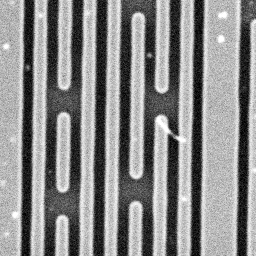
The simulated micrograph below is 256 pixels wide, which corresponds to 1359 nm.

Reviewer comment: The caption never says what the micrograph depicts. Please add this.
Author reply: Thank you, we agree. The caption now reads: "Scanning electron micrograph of groups of lines, slits or small figures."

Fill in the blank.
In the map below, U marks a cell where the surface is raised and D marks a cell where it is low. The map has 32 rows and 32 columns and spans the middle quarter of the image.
UUDDDUUUDDDUUUDDDUUUDDDUUUDDDUUU
UUDDDUUUDDDUUUDDDUUUDDDUUUDDDUUU
UUDDDUUUDDDUUUDDDUUUDDDUUUDDDUUU
UUDDDUUUDDDUUUDDDUUUDDDUUUDDDUUU
UDDDDUUUDDDUUUDDDUUUDDDUUUDDDUUU
UDDDDUUDDDDUUUDDDUUUDDDUUUDDDUUU
DDDDDUUDDDDUUUDDDUUUDDDUUUDDDUUU
DDDDDUUDDDDUUUDDDUUUDDDDDDDDDUUU
DDDDDUUDDDDUUUDDDUUUDDDDDDDDDUUU
DDDDDUUDDDDUUUDDDUUUDDDDDDDDDUUU
DDDDDUUDDDDUUUDDDUUUDDDDDDDDDUUU
DDDDDUUDDDDUUUDDDUUUDDDDDDDDDUUU
UDDDDUUDDDDUUUDDDUUUDDDDDDDDDUUU
UDDDDUUDDDDUUUDDDUUUDDDUUUDDDUUU
UDDDDUUDDDDUUUDDDUUUDDDUUUDDDUUU
UDDDDUUDDDDUUUDDDUUUDDDUUUDDDUUU
UDDDDUUDDDDUUUDDDUUUDDDUUUDDDUUU
UDDDDUUDDDDUUDDDDUUUDDDUUUDDDUUU
UDDDDUUDDDDUUDDDDUUUDDDUUUDDDUUU
UDDDDUUDDDDUUDDDDUUUDDDUUUDDDUUU
UDDDDUUDDDDUUDDDDUUUDDDUUUDDDUUU
UDDDDUUDDDDUUDDDDUUUDDDUUUDDDUUU
UDDDDUUDDDDUUDDDDUUUDDDUUUDDDUUU
UDDDDUUDDDDUUDDDDUUUDDDUUUDDDUUU
UDDDDUUDDDDUUDDDDUUUDDDUUUDDDUUD
UDDDDUUDDDDUUDDDDUUUDDDUUUDDDUUD
UDDDDUUDDDDUUDDDDUUUDDDUUUDDDUUD
UDDDDUUDDDUUUDDDDUUDDDDUUUDDDUUD
UDDDDUUDDDUUUDDDDDUDDDDUUUDDDUUD
UDDDDUUDDDUUUDDDDDDDDDDUUUDDDUUD
UDDDDUUDDDUUUDDDDDDDDDDUUUDDDUUD
UDDDUUUDDDUUUDDDDDDDDDDUUUDDDUUD